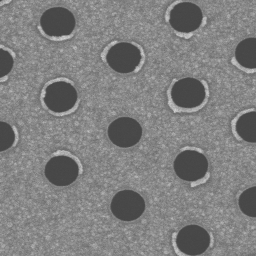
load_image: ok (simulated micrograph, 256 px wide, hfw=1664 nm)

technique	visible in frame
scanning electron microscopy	a regular array of holes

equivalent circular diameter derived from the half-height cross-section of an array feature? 213 nanometres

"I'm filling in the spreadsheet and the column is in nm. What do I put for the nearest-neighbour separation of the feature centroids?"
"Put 479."